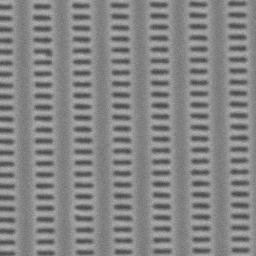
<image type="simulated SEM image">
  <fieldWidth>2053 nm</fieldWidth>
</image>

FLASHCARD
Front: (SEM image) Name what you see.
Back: a regular array of holes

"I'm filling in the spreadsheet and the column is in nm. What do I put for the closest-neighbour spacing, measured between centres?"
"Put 87.8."